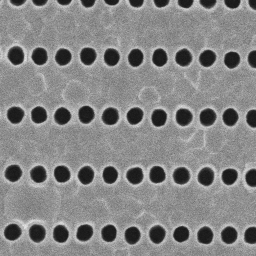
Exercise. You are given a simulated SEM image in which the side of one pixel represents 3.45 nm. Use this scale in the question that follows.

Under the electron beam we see a regular array of holes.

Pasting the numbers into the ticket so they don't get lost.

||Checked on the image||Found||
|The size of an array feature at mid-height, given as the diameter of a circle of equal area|54.4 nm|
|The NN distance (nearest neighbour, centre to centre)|0.0821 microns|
